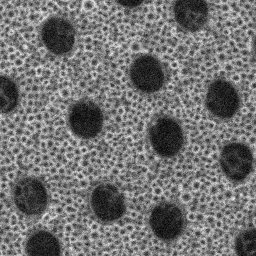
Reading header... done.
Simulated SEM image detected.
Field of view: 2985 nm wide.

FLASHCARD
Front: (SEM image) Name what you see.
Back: a regular array of raised bodies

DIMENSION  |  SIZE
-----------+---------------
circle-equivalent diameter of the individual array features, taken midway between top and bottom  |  0.462 um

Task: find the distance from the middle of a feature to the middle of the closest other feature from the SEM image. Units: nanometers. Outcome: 760